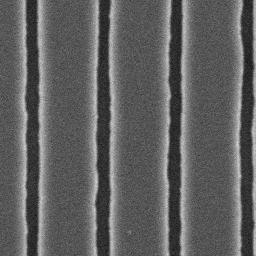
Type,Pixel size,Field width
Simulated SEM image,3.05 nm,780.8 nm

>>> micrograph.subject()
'lines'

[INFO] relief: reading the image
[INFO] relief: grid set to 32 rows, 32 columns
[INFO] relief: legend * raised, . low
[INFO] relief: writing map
***..*******..*******..*******..
***..*******..*******..*******..
***..*******..*******..*******..
***..*******..*******..*******..
***..*******..*******..*******..
***..*******..*******..*******..
***..*******..*******..*******..
***..*******..*******..*******..
***..*******..*******..*******..
***..*******..*******..*******..
***..*******..*******..*******..
***..*******..*******..*******..
***..*******..*******..*******..
***..*******..*******..*******..
***..*******..*******..*******..
***..*******..*******..*******..
***..*******..*******..*******..
***..*******..*******..*******..
***..*******..*******..*******..
***..*******..*******..*******..
***..*******..*******..*******..
***..*******..*******..*******..
***..*******..*******..*******..
***..*******..*******..*******..
***..*******..*******..*******..
***..*******..*******..*******..
***..*******..*******..*******..
***..*******..*******..*******..
***..*******..*******..*******..
***..*******..*******..*******..
***..*******..*******..*******..
***..*******..*******..*******..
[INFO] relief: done